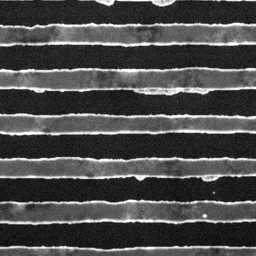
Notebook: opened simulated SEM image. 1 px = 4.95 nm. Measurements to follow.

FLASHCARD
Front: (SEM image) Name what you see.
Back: lines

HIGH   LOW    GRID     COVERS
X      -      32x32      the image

--------------------X-----------
--------------------------------
--------------------------------
XXXXXXXXXXXXXXXXXXXXXXXXXXXXXXXX
XXXXXXXXXXXXXXXXXXXXXXXXXXXXXXXX
XX-XXX------XXXXXXXXXX----XXXX--
--------------------------------
--------------------------------
------------------------X-------
XXXXXXXXXXXXXXXXXXXXXXXXXXXXXXXX
XXXXXXXXXXXXXXXXXXXXXXXXXXXXXXXX
------------------XXXX----------
--------------------------------
--------------------------------
XXXXX--XXXXXXXX---XXX--X--------
XXXXXXXXXXXXXXXXXXXXXXXXXXXXXXXX
XXXXXXXXXXXXXXXXXXXXX-----XXXX-X
--------------------------------
--------------------------------
--------------------------------
XXXXXXXXXXXXXXXXXXXXXXXXXXXXXXXX
XXXXXXXXXXXXXXXXXXXXXXXXXXXXXXXX
--------------------------------
--------------------------------
--------------------------------
XXXXXXXXXXXXXXXXXXXXXXXXXXXXXXXX
XXXXXXXXXXXXXXXXXXXXXXXXXXXXXXXX
XXXXXXXXXXXXXXXXXXXXXXXXXXXXXXXX
--------------------------------
--------------------------------
--------------------------------
XXXXXXXXXXXXXXXXXXXXXXXXXXXXXXXX